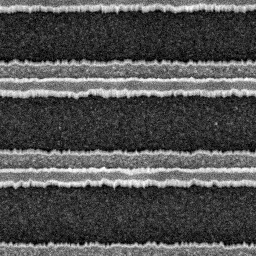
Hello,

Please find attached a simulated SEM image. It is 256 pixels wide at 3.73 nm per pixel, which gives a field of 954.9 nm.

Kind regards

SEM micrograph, lines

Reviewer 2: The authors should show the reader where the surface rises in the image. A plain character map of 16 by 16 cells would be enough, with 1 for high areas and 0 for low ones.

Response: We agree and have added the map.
1111111111111111
0000000000000000
0000000000000000
0000000000000000
1111111111111111
1111111111111111
0000000000000000
0000000000000000
0000000000000000
0000000000000000
1111111111111111
1111111111111111
0000000000000000
0000000000000000
0000000000000000
1111111111111111